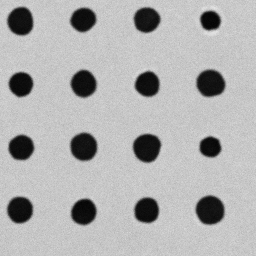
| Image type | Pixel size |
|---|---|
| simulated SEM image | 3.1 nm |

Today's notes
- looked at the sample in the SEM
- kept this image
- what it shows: a regular array of holes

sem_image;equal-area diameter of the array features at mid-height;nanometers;78.8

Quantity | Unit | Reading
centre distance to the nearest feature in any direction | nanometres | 194